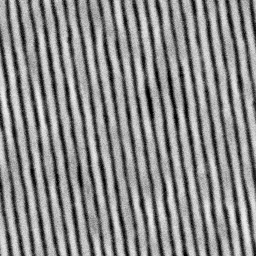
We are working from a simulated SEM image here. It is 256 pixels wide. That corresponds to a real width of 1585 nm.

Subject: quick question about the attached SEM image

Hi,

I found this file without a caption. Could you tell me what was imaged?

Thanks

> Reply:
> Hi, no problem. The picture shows parallel lines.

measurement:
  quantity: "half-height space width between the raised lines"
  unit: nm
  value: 27.5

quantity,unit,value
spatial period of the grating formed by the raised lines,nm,71.3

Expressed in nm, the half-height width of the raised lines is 43.6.